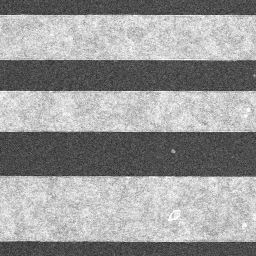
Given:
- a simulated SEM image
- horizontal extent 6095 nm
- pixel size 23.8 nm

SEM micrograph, groups of lines, slits or small figures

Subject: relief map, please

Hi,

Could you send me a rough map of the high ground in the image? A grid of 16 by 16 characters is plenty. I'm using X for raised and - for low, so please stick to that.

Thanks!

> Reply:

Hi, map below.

----------------
XXXXXXXXXXXXXXXX
XXXXXXXXXXXXXXXX
XXXXXXXXXXXXXXXX
----------------
----------------
XXXXXXXXXXXXXXXX
XXXXXXXXXXXXXXXX
----------------
----------------
----------------
XXXXXXXXXXXXXXXX
XXXXXXXXXXXXXXXX
XXXXXXXXXXXXXXXX
XXXXXXXXXXXXXXXX
----------------